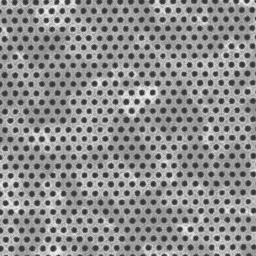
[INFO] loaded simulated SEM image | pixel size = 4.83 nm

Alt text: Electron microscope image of a regular array of holes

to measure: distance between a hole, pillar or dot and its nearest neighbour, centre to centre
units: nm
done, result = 48.9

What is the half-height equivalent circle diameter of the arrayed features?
31.3 nanometers